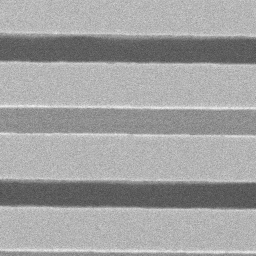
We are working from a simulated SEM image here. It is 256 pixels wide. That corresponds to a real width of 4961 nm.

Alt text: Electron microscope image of lines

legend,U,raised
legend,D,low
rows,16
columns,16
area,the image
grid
UUUUUUUUUUUUUUUU
UUUUUUUUUUUUUUUU
DDDDDDDDDDDDDDDD
DDDDDDDDDDDDDDDD
UUUUUUUUUUUUUUUU
UUUUUUUUUUUUUUUU
UUUUUUUUUUUUUUUU
UUUUUUUUUUUUUUUU
UUUUUUUUUUUUUUUU
UUUUUUUUUUUUUUUU
UUUUUUUUUUUUUUUU
DDDDDDDDDDDDDDDD
DDDDDDDDDDDDDDDD
UUUUUUUUUUUUUUUU
UUUUUUUUUUUUUUUU
UUUUUUUUUUUUUUUU